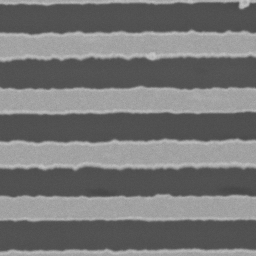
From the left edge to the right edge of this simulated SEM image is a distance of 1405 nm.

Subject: lines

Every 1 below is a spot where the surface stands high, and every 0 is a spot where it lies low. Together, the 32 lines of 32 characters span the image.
11111110001000000000000000000010
00000000000000000000000000000000
00000000000000000000000000000000
00000000000000000000000000000000
11111111111111111111111111111111
11111111111111111111111111111111
11111111111111111111111111111111
10000000000000000000000000000000
00000000000000000000000000000000
00000000000000000000000000000000
00000000000000000000000000000000
11111111111111111111111111111111
11111111111111111111111111111111
11111111111111111111111111111111
00000000000000000000000000000000
00000000000000000000000000000000
00000000000000000000000000000000
00000000000000100000110000001100
11111111111111111111111111111111
11111111111111111111111111111111
11111111111111111111111111111111
00000000000000000000000000000000
00000000000000000000000000000000
00000000000000000000000000000000
00000000000000000001100000000100
11111111111111111111111111111111
11111111111111111111111111111111
11111111111101110111111011111110
00000000000000000000000000000000
00000000000000000000000000000000
00000000000000000000000000000000
11111111111111111111111111111111